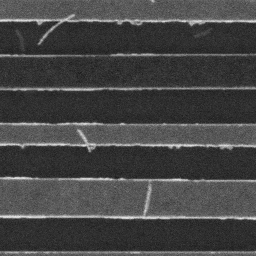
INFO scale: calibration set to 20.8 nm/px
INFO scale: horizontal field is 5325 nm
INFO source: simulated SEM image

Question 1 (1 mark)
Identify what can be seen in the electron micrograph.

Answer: lines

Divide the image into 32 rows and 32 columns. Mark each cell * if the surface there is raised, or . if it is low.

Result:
********************************
********************************
********************************
................................
................................
................................
................................
********************************
********************************
********************************
********************************
................................
................................
................................
................................
******.******..*....*...........
********************************
********************************
................................
................................
................................
................................
************************........
********************************
********************************
********************************
********************************
................................
................................
................................
................................
................................